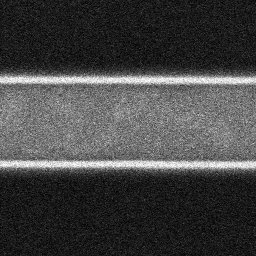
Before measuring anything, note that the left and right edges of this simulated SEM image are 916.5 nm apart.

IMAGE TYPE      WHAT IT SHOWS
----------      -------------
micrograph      one or a few lines or trenches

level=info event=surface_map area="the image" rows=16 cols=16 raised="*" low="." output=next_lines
****************
****************
****************
****************
****************
................
................
................
................
................
****************
****************
****************
****************
****************
****************